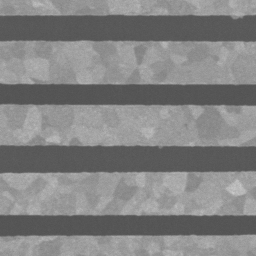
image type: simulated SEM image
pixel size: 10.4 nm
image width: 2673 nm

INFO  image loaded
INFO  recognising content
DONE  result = lines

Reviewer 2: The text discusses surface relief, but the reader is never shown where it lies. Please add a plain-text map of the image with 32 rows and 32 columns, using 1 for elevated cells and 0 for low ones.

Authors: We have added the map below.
11111111111111111111111111111111
11111111111111111111111111111111
00000000000000000000000000000000
00000000000000000000000000000000
00000000000000000000000000000000
11111111111111111111111111111111
11111111111111111111111111111111
11111111111111111111111111111111
11111111111111111111111111111111
11111111111111111111111111111111
00000000000000000000000000000000
00000000000000000000000000000000
00000000000000000000000000000000
11111111111111111111111111111111
11111111111111111111111111111111
11111111111111111111111111111111
11111111111111111111111111111111
11111111111111111111111111111111
00000000000000000000000000000000
00000000000000000000000000000000
00000000000000000000000000000000
00000000000000000000000000000011
11111111111111111111111111111111
11111111111111111111111111111111
11111111111111111111111111111111
11111111111111111111111111111111
11111111111111111111111111111111
00000000000000000000000000000000
00000000000000000000000000000000
00000000000000000000000010000011
11111111111111111111111111111111
11111111111111111111111111111111